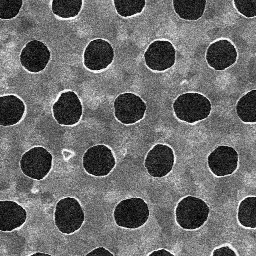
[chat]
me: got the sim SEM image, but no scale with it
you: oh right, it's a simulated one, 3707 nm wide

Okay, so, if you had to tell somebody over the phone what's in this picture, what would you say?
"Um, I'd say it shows a regular array of holes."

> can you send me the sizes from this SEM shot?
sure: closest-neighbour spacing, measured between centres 875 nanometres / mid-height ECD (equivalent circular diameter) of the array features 0.465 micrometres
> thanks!